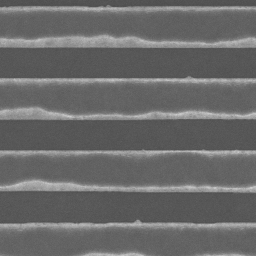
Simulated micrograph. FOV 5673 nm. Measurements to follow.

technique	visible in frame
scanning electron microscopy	lines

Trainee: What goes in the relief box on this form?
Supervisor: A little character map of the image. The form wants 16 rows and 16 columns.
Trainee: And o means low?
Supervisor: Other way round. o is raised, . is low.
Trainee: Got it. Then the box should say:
oooooooooooooooo
oooooooooooooooo
oooooooooooooooo
................
................
oooooooooooooooo
oooooooooooooooo
................
................
oooooooooooooooo
oooooooooooooooo
oooooooooooooooo
................
................
oooooooooooooooo
oooooooooooooooo